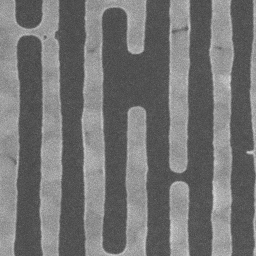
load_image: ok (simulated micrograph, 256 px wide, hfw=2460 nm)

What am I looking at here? parallel lines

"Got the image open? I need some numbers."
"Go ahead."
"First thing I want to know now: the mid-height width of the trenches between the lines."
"232 nm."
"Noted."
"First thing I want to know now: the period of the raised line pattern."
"409 nm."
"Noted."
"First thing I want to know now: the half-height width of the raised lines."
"163 nm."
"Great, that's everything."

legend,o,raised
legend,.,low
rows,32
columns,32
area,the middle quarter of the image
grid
.....oooo..................oooo.
.....ooooo.................oooo.
.....ooooo.................oooo.
.....ooooo.................oooo.
.....ooooo................ooooo.
.....oooo..................oooo.
.....oooo...................ooo.
.....ooooo..................ooo.
.....ooooo................ooooo.
.....ooooo................ooooo.
.....oooo.................ooooo.
.....oooo........ooo.......oooo.
.....ooo........oooo.......oooo.
.....ooo........oooo.......oooo.
.....ooo........oooo.......oooo.
................oooo.......oooo.
.........o......oooo.......oooo.
.......ooo......oooo......ooooo.
.......ooo......oooo......ooooo.
.......ooo......oooo.......oooo.
.......ooo......oooo.......oooo.
.....oo.oo......oooo.......oooo.
.....ooooo......oooo.......oooo.
.....ooooo......ooooo......oooo.
.....ooooo......ooooo......oooo.
.....ooo.o......o.ooo......oooo.
.....o..........oo..o......ooo..
.....ooo........oooo............
.....ooooo......oooo............
.....ooooo......oooo............
.....ooooo......oooo.......oooo.
.....ooooo......oooo.......oooo.